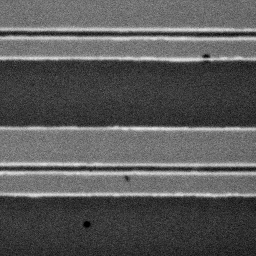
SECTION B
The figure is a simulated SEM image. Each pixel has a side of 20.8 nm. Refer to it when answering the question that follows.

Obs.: lines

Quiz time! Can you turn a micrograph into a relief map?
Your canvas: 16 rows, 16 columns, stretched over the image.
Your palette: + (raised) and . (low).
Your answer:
++++++++++++++++
++++++++++++++++
++++++++++++++++
++++++++++++++++
................
................
................
................
++++++++++++++++
++++++++++++++++
++++++++++++++++
++++++++++++++++
................
................
................
................